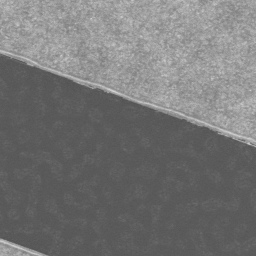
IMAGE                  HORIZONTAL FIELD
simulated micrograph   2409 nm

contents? one or a few lines or trenches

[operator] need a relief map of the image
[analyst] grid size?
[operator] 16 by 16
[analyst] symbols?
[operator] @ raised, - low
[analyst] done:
@@@@@@@@@@@@@@@@
@@@@@@@@@@@@@@@@
@@@@@@@@@@@@@@@@
-@@@@@@@@@@@@@@@
----@@@@@@@@@@@@
-------@@@@@@@@@
---------@@@@@@@
------------@@@@
---------------@
----------------
----------------
----------------
----------------
----------------
----------------
@---------------